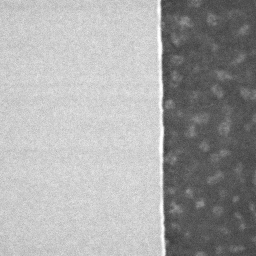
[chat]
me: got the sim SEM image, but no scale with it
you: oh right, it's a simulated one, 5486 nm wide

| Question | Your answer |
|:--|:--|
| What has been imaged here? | one or a few lines or trenches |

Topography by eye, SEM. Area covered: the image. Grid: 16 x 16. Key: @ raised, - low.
@@@@@@@@@@------
@@@@@@@@@@------
@@@@@@@@@@------
@@@@@@@@@@------
@@@@@@@@@@------
@@@@@@@@@@------
@@@@@@@@@@------
@@@@@@@@@@------
@@@@@@@@@@------
@@@@@@@@@@------
@@@@@@@@@@------
@@@@@@@@@@------
@@@@@@@@@@------
@@@@@@@@@@------
@@@@@@@@@@------
@@@@@@@@@@------